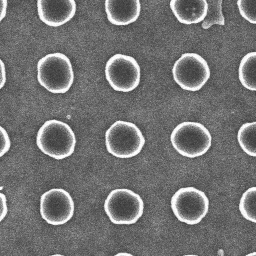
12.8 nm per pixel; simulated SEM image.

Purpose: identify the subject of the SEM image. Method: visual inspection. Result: a regular array of raised bodies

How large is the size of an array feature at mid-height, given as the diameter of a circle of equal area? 34.9 pixels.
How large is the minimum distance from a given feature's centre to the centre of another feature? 850 nanometers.